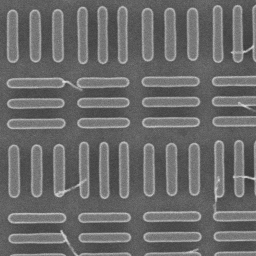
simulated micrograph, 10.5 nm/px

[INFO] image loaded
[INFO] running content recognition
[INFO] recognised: groups of lines, slits or small figures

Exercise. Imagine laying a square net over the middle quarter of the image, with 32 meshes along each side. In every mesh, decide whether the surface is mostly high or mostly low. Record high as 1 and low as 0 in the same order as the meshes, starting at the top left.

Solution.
00000000000000000000000000000000
00000000000000000000000000000000
00000000000000000000000000000000
00000111100001100000111111111111
10011111111111110000111111111111
00001111111111100000000011110000
00000000000000000000000000000000
00000000000000000000000000000000
00000000000000000000001111111111
00011111111111110000111111111111
00001111111111110000111111111111
00000000000000000000000000000000
00000000000000000000000000000000
00000000000000000000011111111111
00011111111111110000111111111111
00001111111111110000111111111111
00000000000000000000000000000000
00000000000000000000000000000000
00000000000000000000000000000000
00000000000000000000000000000000
00001100011000110000110000110001
00001100011000110000110000110001
00001100011000110000110000110001
00001100011000110000110000110001
00001100011000110000110000110001
00001100011000110000111000110001
00001100011000110000111000110001
00001100011000110000111000110001
00001100011000110000111000110001
00001100011000110000111000110001
00001100011000110000111000110001
10001100011000110000111000110001